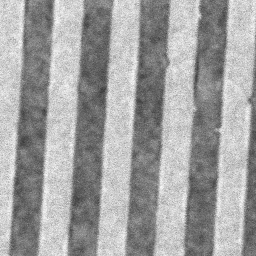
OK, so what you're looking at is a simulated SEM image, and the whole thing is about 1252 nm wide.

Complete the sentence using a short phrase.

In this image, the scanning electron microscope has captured parallel lines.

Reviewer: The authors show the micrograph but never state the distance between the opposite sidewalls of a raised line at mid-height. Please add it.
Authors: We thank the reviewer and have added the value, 27 px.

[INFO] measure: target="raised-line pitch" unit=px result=58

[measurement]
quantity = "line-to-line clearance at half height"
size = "0.156 microns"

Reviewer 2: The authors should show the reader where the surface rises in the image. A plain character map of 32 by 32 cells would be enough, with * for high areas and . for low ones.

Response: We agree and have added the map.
***....***....***....****....***
***....***....***....****....***
***....***....***....****....***
***....***....***....****....***
***....***....***....****...****
***....***....***....****...****
***....***....***....***....****
***....***....***....***....****
**....****....***....***....****
**....****....***....****...***.
**....****....***....***....***.
**....****....***....***....***.
**....***....****....***....***.
**....***....****....***....***.
**....***....****....***....***.
**....***....****...****....***.
**....***....***....****...****.
**....***....***....****....***.
**....***....***....****....***.
**....***....***....****...****.
**....***....***....***....****.
**....***....***....***....****.
**....***....***....***....****.
**...****....***....***....****.
*.....***....***....***....****.
*....****....***....***....***..
*....****....***....***....***..
*....****...****....***....***..
*....***....****....***....***..
*....***....****....***....***..
*....***....****....***....***..
*....***....***....****....***..